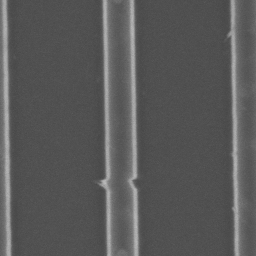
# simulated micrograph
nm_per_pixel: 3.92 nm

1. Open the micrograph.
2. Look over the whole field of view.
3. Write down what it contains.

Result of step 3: one or a few lines or trenches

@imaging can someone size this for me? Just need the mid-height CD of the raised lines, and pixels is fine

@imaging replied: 28.1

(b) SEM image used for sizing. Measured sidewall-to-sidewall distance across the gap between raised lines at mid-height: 0.389 µm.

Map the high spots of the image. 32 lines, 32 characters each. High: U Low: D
UDDDDDDDDDDDDUUUUDDDDDDDDDDDDUUU
UDDDDDDDDDDDDUUUUDDDDDDDDDDDDUUU
UDDDDDDDDDDDDUUUUDDDDDDDDDDDDUUU
UDDDDDDDDDDDDUUUUDDDDDDDDDDDDUUU
UDDDDDDDDDDDDUUUUDDDDDDDDDDDDUUU
UDDDDDDDDDDDDUUUUDDDDDDDDDDDDUUU
UDDDDDDDDDDDDUUUUDDDDDDDDDDDDUUU
UDDDDDDDDDDDDUUUUDDDDDDDDDDDDUUU
UDDDDDDDDDDDDUUUUDDDDDDDDDDDDUUU
UDDDDDDDDDDDDUUUUDDDDDDDDDDDDUUU
UDDDDDDDDDDDDUUUUDDDDDDDDDDDDUUU
UDDDDDDDDDDDDUUUUDDDDDDDDDDDDUUU
UDDDDDDDDDDDDUUUUDDDDDDDDDDDDUUU
UDDDDDDDDDDDDUUUUDDDDDDDDDDDDUUU
UDDDDDDDDDDDDUUUUDDDDDDDDDDDDUUU
UDDDDDDDDDDDDUUUUDDDDDDDDDDDDUUU
UDDDDDDDDDDDDUUUUDDDDDDDDDDDDUUU
UDDDDDDDDDDDDUUUUDDDDDDDDDDDDUUU
UDDDDDDDDDDDDUUUUDDDDDDDDDDDDUUU
UDDDDDDDDDDDDUUUUDDDDDDDDDDDDUUU
UDDDDDDDDDDDDUUUUDDDDDDDDDDDDUUU
UDDDDDDDDDDDDUUUUDDDDDDDDDDDDUUU
UDDDDDDDDDDDDUUUUDDDDDDDDDDDDUUU
UDDDDDDDDDDDDUUUUDDDDDDDDDDDDUUU
UDDDDDDDDDDDDDUUUDDDDDDDDDDDDUUU
UDDDDDDDDDDDDDUUUDDDDDDDDDDDDUUU
UDDDDDDDDDDDDDUUUDDDDDDDDDDDDUUU
UDDDDDDDDDDDDDUUUDDDDDDDDDDDDDUU
UDDDDDDDDDDDDDUUUDDDDDDDDDDDDDUU
UDDDDDDDDDDDDDUUUDDDDDDDDDDDDDUU
UDDDDDDDDDDDDDUUUDDDDDDDDDDDDDUU
UDDDDDDDDDDDDDUUUDDDDDDDDDDDDDUU